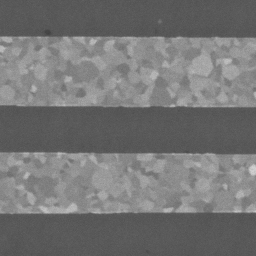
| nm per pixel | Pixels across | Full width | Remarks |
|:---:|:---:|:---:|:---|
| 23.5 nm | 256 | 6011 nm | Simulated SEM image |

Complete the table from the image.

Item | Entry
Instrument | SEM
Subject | lines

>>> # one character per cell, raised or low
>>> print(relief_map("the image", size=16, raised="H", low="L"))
LLLLLLLLLLLLLLLL
LLLLLLLLLLLLLLLL
HHHHHHHHHHHHHHHH
HHHHHHHHHHHHHHHH
HHHHHHHHHHHHHHHH
HHHHHHHHHHHHHHHH
HHHHHHHHHHHHHHHH
LLLLLLLLLLLLLLLL
LLLLLLLLLLLLLLLL
LLLLLLLLLLLLLLLL
HHHHHHHHHHHHHHHH
HHHHHHHHHHHHHHHH
HHHHHHHHHHHHHHHH
LLLLLLLLLLLLLLLL
LLLLLLLLLLLLLLLL
LLLLLLLLLLLLLLLL